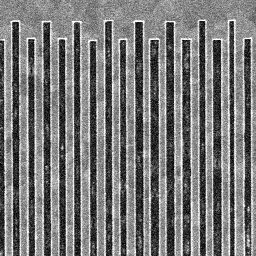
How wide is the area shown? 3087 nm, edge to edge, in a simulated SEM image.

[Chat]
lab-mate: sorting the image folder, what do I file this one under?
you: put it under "parallel lines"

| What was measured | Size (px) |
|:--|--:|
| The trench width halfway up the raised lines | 7.62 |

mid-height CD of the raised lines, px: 7.5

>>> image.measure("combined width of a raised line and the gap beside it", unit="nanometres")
186